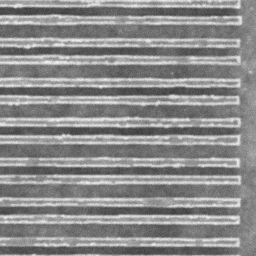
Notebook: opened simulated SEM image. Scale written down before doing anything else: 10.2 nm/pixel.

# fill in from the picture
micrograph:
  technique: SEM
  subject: parallel lines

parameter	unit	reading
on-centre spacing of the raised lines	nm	207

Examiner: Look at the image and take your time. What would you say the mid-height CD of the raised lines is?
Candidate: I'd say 88.3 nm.